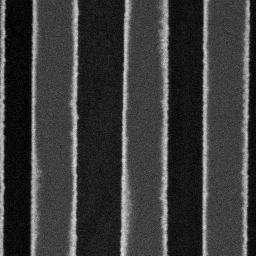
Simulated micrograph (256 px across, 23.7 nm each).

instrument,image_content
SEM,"lines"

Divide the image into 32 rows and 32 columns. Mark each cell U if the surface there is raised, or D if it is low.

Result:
UDDDUUUUUUDDDDDDUUUUUDDDDDUUUUUD
UDDDUUUUUUDDDDDDUUUUUDDDDDUUUUUD
UDDDUUUUUUDDDDDDUUUUUDDDDDUUUUUD
UDDDUUUUUUDDDDDDUUUUUDDDDUUUUUUD
UDDDUUUUUUDDDDDDUUUUUDDDDDUUUUUD
UDDDUUUUUUDDDDDDUUUUUDDDDDUUUUUD
UDDDUUUUUUDDDDDDUUUUUDDDDDUUUUUD
UDDDUUUUUUDDDDDDUUUUUDDDDDUUUUUD
UDDDUUUUUUDDDDDUUUUUUDDDDDUUUUUD
DDDDUUUUUUDDDDDUUUUUUDDDDDUUUUUD
UDDDUUUUUUDDDDDUUUUUUDDDDDUUUUUD
UDDDUUUUUUDDDDDUUUUUUDDDDUUUUUUD
UDDDUUUUUUDDDDDUUUUUUDDDDUUUUUUD
UDDDUUUUUDDDDDDUUUUUUDDDDUUUUUUD
UDDDUUUUUUDDDDDUUUUUUDDDDUUUUUUD
DDDDUUUUUUDDDDDUUUUUUDDDDUUUUUUD
DDDDUUUUUUDDDDDUUUUUUDDDDUUUUUUD
DDDDUUUUUUDDDDDUUUUUUDDDDUUUUUUD
DDDDUUUUUUDDDDDUUUUUUDDDDUUUUUUD
UDDDUUUUUUDDDDDUUUUUUDDDDUUUUUUD
DDDDUUUUUUDDDDDUUUUUUDDDDUUUUUUD
DDDDUUUUUDDDDDDUUUUUUDDDDUUUUUUD
DDDDUUUUUUDDDDDUUUUUUDDDDUUUUUUD
UDDDUUUUUUDDDDDUUUUUUDDDDUUUUUUD
DDDDUUUUUUDDDDDUUUUUUDDDDUUUUUUD
DDDDUUUUUUDDDDDUUUUUUDDDDUUUUUUD
DDDDUUUUUDDDDDDUUUUUUDDDDUUUUUUD
DDDDUUUUUUDDDDDUUUUUUDDDDUUUUUUD
DDDDUUUUUDDDDDDUUUUUUDDDDUUUUUUD
DDDDUUUUUDDDDDDUUUUUUDDDDUUUUUUD
DDDDUUUUUDDDDDDUUUUUUDDDDUUUUUUD
DDDDUUUUUDDDDDDUUUUUUDDDDUUUUUUD